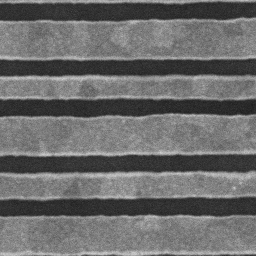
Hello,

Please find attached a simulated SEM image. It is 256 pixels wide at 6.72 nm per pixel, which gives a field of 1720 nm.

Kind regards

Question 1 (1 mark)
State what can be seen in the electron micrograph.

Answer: lines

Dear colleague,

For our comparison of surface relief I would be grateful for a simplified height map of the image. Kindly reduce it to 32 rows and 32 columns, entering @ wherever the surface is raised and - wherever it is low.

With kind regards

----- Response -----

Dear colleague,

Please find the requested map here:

--------------------------------
--------------------------------
------------------@@-@@@@@@-@@@@
@@@@@@@@@@@@@@@@@@@@@@@@@@@@@@@@
@@@@@@@@@@@@@@@@@@@@@@@@@@@@@@@@
@@@@@@@@@@@@@@@@@@@@@@@@@@@@@@@@
@@@@@@@@@@@@@@@@@@@@@@@@@@@@@@@@
--------------------------------
--------------------------------
---@----@-@@@---@--@@@@@@@@@@@@@
@@@@@@@@@@@@@@@@@@@@@@@@@@@@@@@@
@@@@@@@@@@@@@@@@@@@@@@@@@@@@@@@@
--------------------------------
--------------------------------
-------------@@---@@@@@@@@@@@@@@
@@@@@@@@@@@@@@@@@@@@@@@@@@@@@@@@
@@@@@@@@@@@@@@@@@@@@@@@@@@@@@@@@
@@@@@@@@@@@@@@@@@@@@@@@@@@@@@@@@
@@@@@@@@@@@@@@@@@@@@@@@@@@@@@@@@
--------------------------------
--------------------------------
--------------------------------
@@@@@@@@@@@@@@@@@@@@@@@@@@@@@@@@
@@@@@@@@@@@@@@@@@@@@@@@@@@@@@@@@
@@@@@@@@@@@@@@@@@@@@@@@@@@@@@@--
--------------------------------
--------------------------------
@@@@@@@@@@@@@@@@@@@@@@@@@@@@@@@@
@@@@@@@@@@@@@@@@@@@@@@@@@@@@@@@@
@@@@@@@@@@@@@@@@@@@@@@@@@@@@@@@@
@@@@@@@@@@@@@@@@@@@@@@@@@@@@@@@@
@@@@@@@@@@@@@@@@@@@@@@@@@@@@@@@@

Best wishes